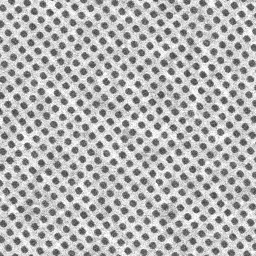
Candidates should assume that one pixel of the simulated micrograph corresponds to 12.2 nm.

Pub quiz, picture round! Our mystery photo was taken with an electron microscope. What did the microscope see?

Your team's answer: a regular array of holes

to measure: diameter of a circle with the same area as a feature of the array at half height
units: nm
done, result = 95.4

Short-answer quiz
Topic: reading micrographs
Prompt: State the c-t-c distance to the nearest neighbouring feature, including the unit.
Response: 0.132 µm